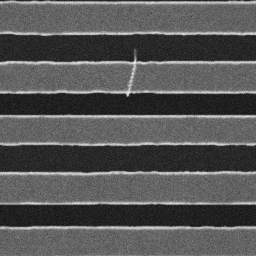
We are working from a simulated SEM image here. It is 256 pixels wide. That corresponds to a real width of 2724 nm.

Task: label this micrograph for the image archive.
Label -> lines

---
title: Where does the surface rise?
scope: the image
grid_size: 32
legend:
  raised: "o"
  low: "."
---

oooooooooooooooooooooooooooooooo
oooooooooooooooooooooooooooooooo
oooooooooooooooooooooooooooooooo
oooooooooooooooooooooooooooooooo
................................
................................
................................
................................
oooooooooooooooooooooooooooooooo
oooooooooooooooooooooooooooooooo
oooooooooooooooooooooooooooooooo
oooooooooooooooooooooooooooooooo
................................
................................
oooooooooooooooooooooooooooooooo
oooooooooooooooooooooooooooooooo
oooooooooooooooooooooooooooooooo
oooooooooooooooooooooooooooooooo
................................
................................
................................
.............ooo.ooo...oo..ooooo
oooooooooooooooooooooooooooooooo
oooooooooooooooooooooooooooooooo
oooooooooooooooooooooooooooooooo
................................
................................
................................
oooooooooooooooooooooooooooooooo
oooooooooooooooooooooooooooooooo
oooooooooooooooooooooooooooooooo
oooooooooooooooooooooooooooooooo